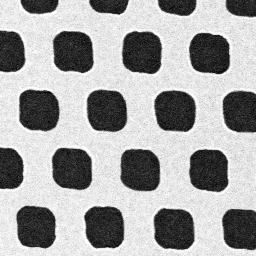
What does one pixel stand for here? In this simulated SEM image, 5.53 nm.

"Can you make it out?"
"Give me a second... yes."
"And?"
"a regular array of holes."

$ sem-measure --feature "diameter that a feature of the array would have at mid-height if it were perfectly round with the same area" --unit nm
237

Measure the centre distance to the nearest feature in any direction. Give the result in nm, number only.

372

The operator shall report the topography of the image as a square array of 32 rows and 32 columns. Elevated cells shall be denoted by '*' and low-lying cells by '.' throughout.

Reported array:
***....****.....****.....***....
****..******...******...*****...
********************************
********************************
..*****....*****....****....****
...****.....***.....****.....***
...****.....***.....****.....***
...****.....***.....****.....***
...****....*****....****....****
********************************
********************************
***...******...*****...******..*
**.....****.....***.....****....
**.....****.....***.....****....
**.....****.....****....****....
***....****.....****....****....
******************************..
********************************
********************************
...****....****.....****....****
...****....****.....****.....***
...***.....****.....****....****
...****....****.....****.....***
..******...*****...******...****
********************************
********************************
**....*****....*****...*****....
**.....****....****.....****....
**.....****.....***.....****....
**.....****.....***.....****....
***....****....*****....****....
********************************